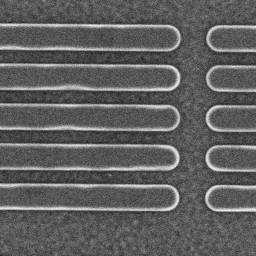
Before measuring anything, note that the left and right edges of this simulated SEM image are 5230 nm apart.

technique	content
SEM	groups of lines, slits or small figures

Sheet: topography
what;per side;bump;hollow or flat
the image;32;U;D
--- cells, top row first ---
DDDDDDDDDDDDDDDDDDDDDDDDDDDDDDDD
DDDDDDDDDDDDDDDDDDDDDDDDDDDDDDDD
DDDDDDDDDDDDDDDDDDDDDDDDDDDDDDDD
UUUUUUUUUUUUUUUUUUUUUUDDDDDUUUUU
UUUUUUUUUUUUUUUUUUUUUUDDDDUUUUUU
UUUUUUUUUUUUUUUUUUUUUUDDDDUUUUUU
DDDDDDDDDDDDDDDDDDDDDDDDDDDDDDDD
DDDDDDDDDDDDDDDDDDDDDDDDDDDDDDDD
UUUUUUUUUUUUUUUUUUUUUUDDDDDUUUUU
UUUUUUUUUUUUUUUUUUUUUUDDDDUUUUUU
UUUUUUUUUUUUUUUUUUUUUUDDDDUUUUUU
DDDDDDDDDDDDDDDDDDDDDDDDDDDDDDDD
DDDDDDDDDDDDDDDDDDDDDDDDDDDDDDDD
UUUUUUUUUUUUUUUUUUUUUUDDDDDUUUUU
UUUUUUUUUUUUUUUUUUUUUUDDDDUUUUUU
UUUUUUUUUUUUUUUUUUUUUUDDDDUUUUUU
DDDDDDDDDDDDDDDDDDDDDDDDDDDDDDDD
DDDDDDDDDDDDDDDDDDDDDDDDDDDDDDDD
UUUUUUUUUUUUUUUUUUUUUUDDDDUUUUUU
UUUUUUUUUUUUUUUUUUUUUUDDDDUUUUUU
UUUUUUUUUUUUUUUUUUUUUUDDDDUUUUUU
DDDDDDDDDDDDDDDDDDDDDDDDDDDDDDDD
DDDDDDDDDDDDDDDDDDDDDDDDDDDDDDDD
UUUUUUUUUUUUUUUUUUUUUUDDDDDUUUUU
UUUUUUUUUUUUUUUUUUUUUUDDDDUUUUUU
UUUUUUUUUUUUUUUUUUUUUUDDDDUUUUUU
DDDDDDDDDDDDDDDDDDDDDDDDDDDDDDDD
DDDDDDDDDDDDDDDDDDDDDDDDDDDDDDDD
DDDDDDDDDDDDDDDDDDDDDDDDDDDDDDDD
DDDDDDDDDDDDDDDDDDDDDDDDDDDDDDDD
DDDDDDDDDDDDDDDDDDDDDDDDDDDDDDDD
DDDDDDDDDDDDDDDDDDDDDDDDDDDDDDDD